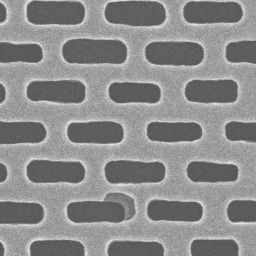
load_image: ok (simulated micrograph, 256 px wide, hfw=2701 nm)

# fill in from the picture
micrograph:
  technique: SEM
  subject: a regular array of holes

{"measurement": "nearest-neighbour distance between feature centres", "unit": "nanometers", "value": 580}